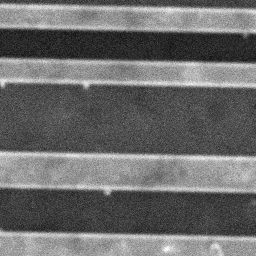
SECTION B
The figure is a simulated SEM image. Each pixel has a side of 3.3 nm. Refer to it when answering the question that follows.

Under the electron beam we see groups of lines, slits or small figures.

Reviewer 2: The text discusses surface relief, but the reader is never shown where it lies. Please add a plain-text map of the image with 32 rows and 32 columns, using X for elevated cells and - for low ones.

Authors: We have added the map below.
--------------------------------
XXXXXXXXXXXXXXXXXXXXXXXXXXXXXXXX
XXXXXXXXXXXXXXXXXXXXXXXXXXXXXXXX
-------XXXXXXXXXXXXXXXXXXXXXXXXX
--------------------------------
--------------------------------
--------------------------------
XXXX----------------------------
XXXXXXXXXXXXXXXXXXXXXXXXXXXXXXXX
XXXXXXXXXXXXXXXXXXXXXXXXXXXXXXXX
------------------XXXXXXXXXXXXXX
--------------------------------
--------------------------------
--------------------------------
--------------------------------
--------------------------------
--------------------------------
--------------------------------
--------------------------------
XXXXXXXXXXXXXXXXXXX-------------
XXXXXXXXXXXXXXXXXXXXXXXXXXXXXXXX
XXXXXXXXXXXXXXXXXXXXXXXXXXXXXXXX
XXXXXXXXXXXXXXXXXXXXXXXXXXXXXXXX
--------XXXXXXXXXXXXXXXXXXXXXXXX
--------------------------------
--------------------------------
--------------------------------
--------------------------------
--------------------------------
XXXXXXXXXXXXXXXXXXXXXX----------
XXXXXXXXXXXXXXXXXXXXXXXXXXXXXXXX
XXXXXXXXXXXXXXXXXXXXXXXXXXXXXXXX